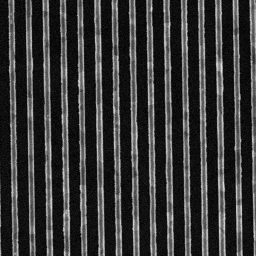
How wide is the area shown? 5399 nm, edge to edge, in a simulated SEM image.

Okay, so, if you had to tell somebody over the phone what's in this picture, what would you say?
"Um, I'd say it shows parallel lines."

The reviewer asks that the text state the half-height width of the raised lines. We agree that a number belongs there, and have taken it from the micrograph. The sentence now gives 100 nanometers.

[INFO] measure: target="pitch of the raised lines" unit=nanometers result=364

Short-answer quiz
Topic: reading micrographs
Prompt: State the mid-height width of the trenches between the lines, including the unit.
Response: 258 nm